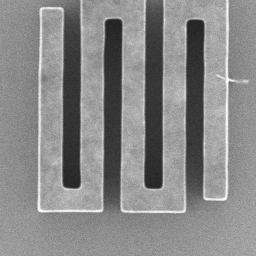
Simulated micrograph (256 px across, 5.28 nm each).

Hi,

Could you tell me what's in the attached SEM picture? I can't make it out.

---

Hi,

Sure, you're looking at groups of lines, slits or small figures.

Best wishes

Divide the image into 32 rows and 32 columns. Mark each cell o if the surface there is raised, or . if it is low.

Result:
..........oooooooo...ooooooo....
.....ooo..oooooooo...ooooooo....
.....ooo..oooo.ooo...ooo.ooo....
.....ooo..ooo..ooo...oo...oo....
.....ooo..ooo..ooo..ooo...oo....
.....ooo..ooo..ooo..ooo..ooo....
.....ooo..ooo..ooo..ooo..ooo....
.....ooo..ooo..ooo..ooo..ooo....
.....ooo..ooo..ooo..ooo...oo....
.....ooo..ooo..ooo..ooo...ooo...
.....ooo..ooo..ooo..ooo..oooo...
.....ooo..ooo..ooo..ooo..ooo....
.....ooo..ooo..ooo..ooo..ooo....
.....ooo..ooo..ooo..ooo..ooo....
.....ooo..ooo..ooo..ooo..ooo....
.....ooo..ooo..ooo..ooo..ooo....
.....ooo..ooo..ooo..ooo..ooo....
.....ooo..ooo..ooo..ooo..ooo....
.....ooo..ooo..ooo..ooo..ooo....
.....ooo..ooo..ooo..ooo..ooo....
.....ooo..ooo..ooo..ooo..ooo....
.....ooo..ooo..ooo..ooo..ooo....
.....ooo..ooo..ooo..ooo..ooo....
.....oooooooo..oooo.ooo..ooo....
.....oooooooo..oooooooo..ooo....
.....oooooooo..oooooooo.........
.................oooooo.........
................................
................................
................................
................................
................................